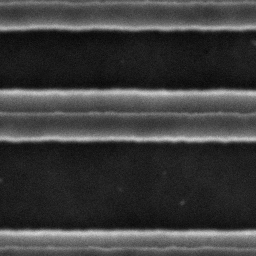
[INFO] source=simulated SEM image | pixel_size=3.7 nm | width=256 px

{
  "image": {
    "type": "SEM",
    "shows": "lines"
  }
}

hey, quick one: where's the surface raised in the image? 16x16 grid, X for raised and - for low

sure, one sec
XXXXXXXXXXXXXXXX
XXXXXXXXXXXXXXXX
----------------
----------------
----------------
----------------
XXXXXXXXXXXXXXXX
XXXXXXXXXXXXXXXX
XXXXXXXXXXXXXXXX
----------------
----------------
----------------
----------------
----------------
----------------
XXXXXXXXXXXXXXXX